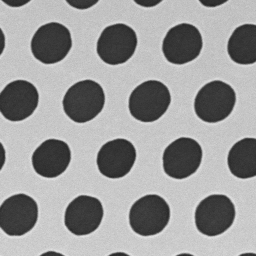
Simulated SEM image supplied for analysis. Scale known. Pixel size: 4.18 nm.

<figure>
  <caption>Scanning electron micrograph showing a regular array of holes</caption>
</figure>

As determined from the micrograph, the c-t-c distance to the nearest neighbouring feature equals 274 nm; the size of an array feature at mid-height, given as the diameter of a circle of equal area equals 0.17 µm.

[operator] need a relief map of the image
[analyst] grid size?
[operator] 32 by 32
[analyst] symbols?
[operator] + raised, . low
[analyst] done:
+..++++++...+++++...+++++...++++
++++++++++++++++++++++++++++++++
++++++++++++++++++++++++++++++++
+++++...+++++...++++++...+++++..
.+++.....++++....++++....++++...
.+++.....+++.....+++.....+++....
++++.....+++.....+++.....+++....
+++++...+++++...+++++...+++++...
++++++++++++++++++++++++++++++++
++++++++++++++++++++++++++++++++
+...+++++...++++++..++++++..++++
.....+++.....+++.....++++....+++
.....+++.....+++.....+++.....+++
....++++.....+++.....+++.....+++
....++++....+++++...+++++...++++
++++++++++++++++++++++++++++++++
++++++++++++++++++++++++++++++++
++++++.+++++++..++++++..++++++..
.++++....++++....++++....++++...
.+++.....+++.....+++.....+++....
.+++.....+++.....+++.....+++....
+++++...+++++...+++++...+++++...
++++++++++++++++++++++++++++++++
++++++++++++++++++++++++++++++++
+...++++++.+++++++..++++++..++++
.....++++....++++....++++....+++
.....+++.....+++.....+++.....+++
.....+++.....+++.....+++.....+++
....++++....++++.....++++....+++
+.++++++++++++++++++++++++++++++
++++++++++++++++++++++++++++++++
++++++.+++++++++++++++++++++++++